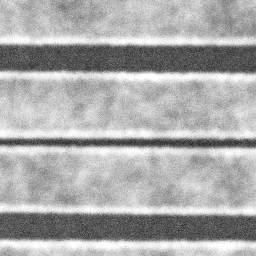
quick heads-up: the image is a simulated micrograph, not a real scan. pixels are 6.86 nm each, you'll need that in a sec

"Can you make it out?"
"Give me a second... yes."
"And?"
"lines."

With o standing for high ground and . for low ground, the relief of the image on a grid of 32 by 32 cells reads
oooooooooooooooooooooooooooooooo
oooooooooooooooooooooooooooooooo
oooooooooooooooooooooooooooooooo
oooooooooooooooooooooooooooooooo
oooooooooooooooooooooooooooooooo
................................
................................
................................
................................
oooooooooooooooooooooo.ooo......
oooooooooooooooooooooooooooooooo
oooooooooooooooooooooooooooooooo
oooooooooooooooooooooooooooooooo
oooooooooooooooooooooooooooooooo
oooooooooooooooooooooooooooooooo
oooooooooooooooooooooooooooooooo
oooooooooooooooooooooooooooooooo
................................
................................
oooooooooooooooooooooooooooooooo
oooooooooooooooooooooooooooooooo
oooooooooooooooooooooooooooooooo
oooooooooooooooooooooooooooooooo
oooooooooooooooooooooooooooooooo
oooooooooooooooooooooooooooooooo
oooooooooooooooooooooooooooooooo
..............................oo
................................
................................
................................
ooooooooooooooooooooooo.oo.oo.o.
oooooooooooooooooooooooooooooooo